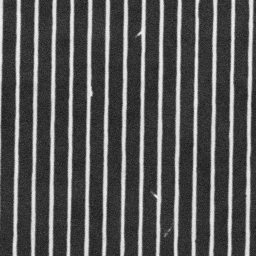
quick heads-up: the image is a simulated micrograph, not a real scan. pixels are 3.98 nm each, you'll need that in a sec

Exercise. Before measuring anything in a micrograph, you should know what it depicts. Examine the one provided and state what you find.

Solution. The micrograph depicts parallel lines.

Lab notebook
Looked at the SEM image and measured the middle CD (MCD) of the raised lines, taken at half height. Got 13.4 nm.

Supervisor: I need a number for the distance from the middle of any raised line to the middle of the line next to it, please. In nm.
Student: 71.2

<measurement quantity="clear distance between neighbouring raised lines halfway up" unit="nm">57.3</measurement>